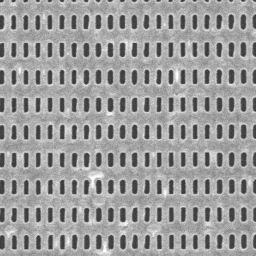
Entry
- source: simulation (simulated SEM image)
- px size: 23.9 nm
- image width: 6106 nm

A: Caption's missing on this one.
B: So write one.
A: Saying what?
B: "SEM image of a regular array of holes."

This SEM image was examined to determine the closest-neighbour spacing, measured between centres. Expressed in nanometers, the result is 286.